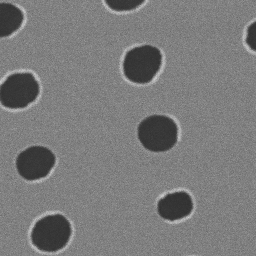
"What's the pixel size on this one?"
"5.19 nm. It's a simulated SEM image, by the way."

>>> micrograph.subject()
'holes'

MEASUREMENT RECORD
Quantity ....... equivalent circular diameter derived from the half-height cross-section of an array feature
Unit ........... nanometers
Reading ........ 197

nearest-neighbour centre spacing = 374 nm